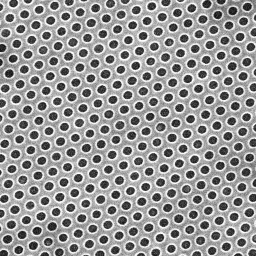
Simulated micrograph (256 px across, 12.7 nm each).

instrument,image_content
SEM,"a regular array of holes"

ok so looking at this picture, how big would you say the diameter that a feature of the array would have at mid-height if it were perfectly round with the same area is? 120 nm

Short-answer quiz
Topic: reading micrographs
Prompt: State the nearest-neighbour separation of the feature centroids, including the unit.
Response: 190 nanometers